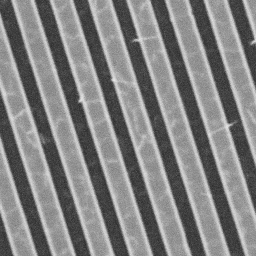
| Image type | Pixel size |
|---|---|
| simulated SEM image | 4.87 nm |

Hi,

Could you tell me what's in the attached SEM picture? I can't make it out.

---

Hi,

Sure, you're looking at parallel lines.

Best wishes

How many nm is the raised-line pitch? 179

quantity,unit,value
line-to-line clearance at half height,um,0.0836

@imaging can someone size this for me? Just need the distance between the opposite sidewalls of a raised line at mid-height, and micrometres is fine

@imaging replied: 0.0964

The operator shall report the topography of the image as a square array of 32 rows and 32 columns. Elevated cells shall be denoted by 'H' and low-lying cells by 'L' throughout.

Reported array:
LLHHLLHHHLLHHHLLHHHLLHHHLLHHLLLH
LLHHHLLHHLLLHHLLHHHLLHHHLLHHHLLH
LLHHHLLHHHLLHHHLLHHLLLHHLLHHHLLH
LLLHHLLHHHLLHHHLLHHHLLHHHLLHHLLL
HLLHHLLLHHLLLHHLLHHHLLHHHLLHHHLL
HLLHHHLLHHHLLHHLLLHHLLLHHLLHHHLL
HLLLHHLLHHHLLHHHLLHHHLLHHLLLHHLL
HHLLHHLLLHHLLLHHLLHHHLLHHHLLHHHL
HHLLHHHLLHHHLLHHLLLHHLLLHHLLHHHL
HHLLHHHLLHHHLLHHHLLHHHLLHHLLLHHL
HHHLLHHLLLHHLLHHHLLHHHLLHHHLLHHH
HHHLLHHHLLHHHLLHHLLLHHLLHHHLLHHH
LHHLLHHHLLHHHLLHHHLLHHHLLHHLLLHH
LHHHLLHHLLLHHLLHHHLLHHHLLHHHLLHH
LHHHLLHHHLLHHHLLHHLLLHHLLHHHLLHH
LLHHLLHHHLLHHHLLHHHLLHHLLLHHLLLH
LLHHHLLHHLLHHHLLHHHLLHHHLLHHHLLH
LLHHHLLHHHLLHHHLLHHLLHHHLLHHHLLH
LLHHHLLHHHLLHHHLLHHHLLHHLLLHHLLH
HLLHHLLLHHLLHHHLLHHHLLHHHLLHHHLL
HLLHHHLLHHHLLHHLLLHHLLHHHLLHHHLL
HLLHHHLLHHHLLHHHLLHHLLLHHLLLHHLL
HHLLHHLLLHHLLHHHLLHHHLLHHHLLHHLL
HHLLHHHLLHHHLLHHLLLHHLLHHHLLHHHL
HHLLHHHLLHHHLLHHHLLHHLLLHHLLLHHL
HHLLLHHLLLHHLLHHHLLHHHLLHHHLLHHL
HHHLLHHHLLHHLLLHHLLHHHLLHHHLLHHH
LHHLLHHHLLHHHLLHHHLLHHLLLHHLLHHH
LHHLLLHHLLHHHLLHHHLLHHHLLHHHLLHH
LHHHLLHHHLLHHLLLHHLLHHHLLHHHLLHH
LHHHLLHHHLLHHHLLHHLLLHHLLLHHLLHH
LLHHLLLHHLLHHHLLHHHLLHHHLLHHLLLH